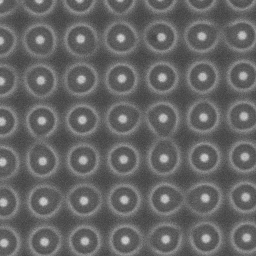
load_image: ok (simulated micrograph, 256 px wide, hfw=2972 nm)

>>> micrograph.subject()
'an array of small figures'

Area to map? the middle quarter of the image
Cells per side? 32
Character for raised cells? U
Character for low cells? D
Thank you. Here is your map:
UUUDDDUUUUUUUDDDUUUUUUUDDDUUUUUU
UUDDDDDUUUUUDDDDDUUUUUDDDDDUUUUU
UDDDDDDDUUUDDDDDDDUUUDDDDDDDUUUD
UDDDUDDDUUUDDDUDDDUUUDDDUDDDUUUD
UDDDUDDDUUUDDDUDDDUUUDDDDDDDUUUD
UDDDDDDUUUUDDDDDDUUUUUDDDDDUUUUU
UUDDDDUUUUUUDDDDDUUUUUUDDDUUUUUU
UUUUUUUUUUUUUUUUUUUUUUUUUUUUUUUU
UUUUUUUUUUUUUUUUUUUUUUUUUUUUUUUU
UUUUUUUUUUUUUUUUUUUUUUUUUUUUUUUU
UUUUUUUUUUUUUDDDDUUUUUUDDDUUUUUU
UUDDDDDUUUUUDDDDDDUUUUDDDDDDUUUU
UDDDDDDDUUUDDDDDDDDUUDDDDDDDUUUU
UDDDUDDDUUUDDDUDDDDUUDDDUUDDUUUD
UDDDUDDDUUUDDDUDDDUUUDDDDDDDUUUD
UDDDDDDDUUUDDDDDDDUUUUDDDDDDUUUU
UUDDDDDUUUUUDDDDDUUUUUDDDDDUUUUU
UUUUUUUUUUUUUUUUUUUUUUUUDDUUUUUU
UUUUUUUUUUUUUUUUUUUUUUUUUUUUUUUU
UUUUUUUUUUUUUUUUUUUUUUUUDDUUUUUU
UUUUUDUUUUUUUUUUUUUUUUUDDDDDUUUU
UUDDDDDDUUUUUDDDDUUUUUDDDDDDUUUU
UUDDDDDDUUUUDDDDDDUUUUDDDDDDDUUU
UDDDUDDDUUUDDDUUDDUUUDDDUUDDDUUU
UDDDUUDDUUUUDDUDDDUUUUDDDDDDUUUU
UUDDDDDDUUUUDDDDDDUUUUDDDDDDUUUU
UUUDDDDUUUUUUDDDDUUUUUUDDDDUUUUU
UUUUUUUUUUUUUUUUUUUUUUUUUUUUUUUU
UUUUUUUUUUUUUUUUUUUUUUUUUUUUUUUU
UUUUUUUUUUUUUUUUUUUUUUUUUUUUUUUU
UUUUDDUUUUUUUUUDUUUUUUUUDDDUUUUU
UUDDDDDDUUUUUDDDDUUUUUUDDDDDUUUU